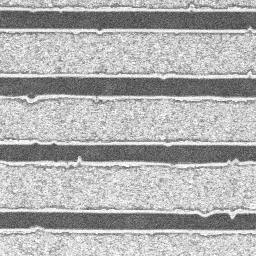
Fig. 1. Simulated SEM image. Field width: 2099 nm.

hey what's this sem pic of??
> one or a few lines or trenches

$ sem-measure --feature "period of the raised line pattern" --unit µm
0.55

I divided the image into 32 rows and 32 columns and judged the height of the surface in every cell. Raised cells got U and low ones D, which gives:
UUUUUUUUUUUUUUUUUUUUUUUUUUUUUUUU
DDDDDDDDDDDDDDDDDDDDDDDDDDDDDDDD
DDDDDDDDDDDDDDDDDDDDDDDDDDDDDDDD
DDDDDDDDDDDDDDDDDDDDDDDDDDDDDDDD
UUUUUUUUUUUUUUUUUUUUUUUUUUUUUUUU
UUUUUUUUUUUUUUUUUUUUUUUUUUUUUUUU
UUUUUUUUUUUUUUUUUUUUUUUUUUUUUUUU
UUUUUUUUUUUUUUUUUUUUUUUUUUUUUUUU
UUUUUUUUUUUUUUUUUUUUUUUUUUUUUUUU
DDDDDDDDDDDDDDDDDDDUUUUUUUUUUUUU
DDDDDDDDDDDDDDDDDDDDDDDDDDDDDDDD
DDDDDDDDDDDDDDDDDDDDDDDDDDDDDDDD
UUUUUUUUUUUUUUUUUUUUUUUUUUUUUUUU
UUUUUUUUUUUUUUUUUUUUUUUUUUUUUUUU
UUUUUUUUUUUUUUUUUUUUUUUUUUUUUUUU
UUUUUUUUUUUUUUUUUUUUUUUUUUUUUUUU
UUUUUUUUUUUUUUUUUUUUUUUUUUUUUUUU
UUUUUUUUUUUUUUUUUUUUUUUUUUUUUUUU
DDDDDDDDDDDDDDDDDDDDDDDDDDDDDDDD
DDDDDDDDDDDDDDDDDDDDDDDDDDDDDDDD
UUUUUUUUUUUDDUUUUUUUDDDDDDDDUUUU
UUUUUUUUUUUUUUUUUUUUUUUUUUUUUUUU
UUUUUUUUUUUUUUUUUUUUUUUUUUUUUUUU
UUUUUUUUUUUUUUUUUUUUUUUUUUUUUUUU
UUUUUUUUUUUUUUUUUUUUUUUUUUUUUUUU
UUUUUUUUUUUUUUUUUUUUUUUUUUUUUUUU
DDDDDDDDDDDDDDDDDDDDDDDUUUUUUUUU
DDDDDDDDDDDDDDDDDDDDDDDDDDDDDDDD
DDDDDDDDDDDDDDDDDDDDDDDDDDDDDDDD
UUUUUUUUUUUUUUUUUUUUUUUUUUUUUUUU
UUUUUUUUUUUUUUUUUUUUUUUUUUUUUUUU
UUUUUUUUUUUUUUUUUUUUUUUUUUUUUUUU